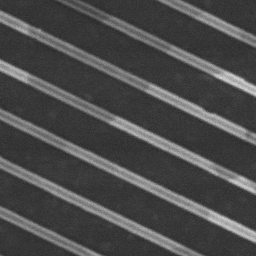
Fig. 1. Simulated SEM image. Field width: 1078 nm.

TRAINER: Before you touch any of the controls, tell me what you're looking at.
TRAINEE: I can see parallel lines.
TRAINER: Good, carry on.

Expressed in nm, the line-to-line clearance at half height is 154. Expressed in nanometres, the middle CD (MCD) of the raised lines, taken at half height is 29.9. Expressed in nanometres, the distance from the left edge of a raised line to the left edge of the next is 186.